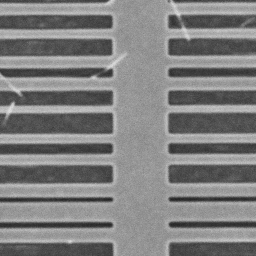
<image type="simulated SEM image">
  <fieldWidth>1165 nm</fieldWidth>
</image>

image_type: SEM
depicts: groups of lines, slits or small figures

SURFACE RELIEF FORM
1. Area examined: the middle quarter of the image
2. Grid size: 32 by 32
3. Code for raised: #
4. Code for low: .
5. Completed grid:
################################
............##############......
............##############......
################################
################################
################################
............###############.....
............##############......
............##############......
............##############......
...........#####################
################################
............##############......
............##############......
............##############......
............##############......
............##############......
............###############.....
################################
################################
............##############......
............##############......
............###############.....
################################
################################
............##############......
............##############......
............##############......
............##############......
............##############......
################################
################################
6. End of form